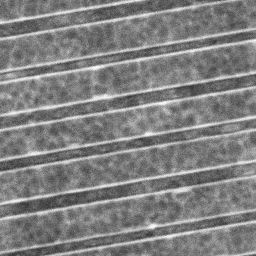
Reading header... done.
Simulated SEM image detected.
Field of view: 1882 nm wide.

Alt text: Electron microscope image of parallel lines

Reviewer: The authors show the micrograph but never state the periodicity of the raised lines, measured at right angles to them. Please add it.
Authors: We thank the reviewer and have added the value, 44.5 pixels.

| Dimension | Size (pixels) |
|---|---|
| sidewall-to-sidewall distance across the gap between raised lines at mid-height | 12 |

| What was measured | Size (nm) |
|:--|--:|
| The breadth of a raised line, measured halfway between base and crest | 243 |